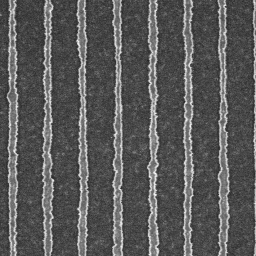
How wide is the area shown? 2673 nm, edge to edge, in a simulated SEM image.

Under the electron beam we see parallel lines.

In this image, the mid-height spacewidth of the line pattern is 28.6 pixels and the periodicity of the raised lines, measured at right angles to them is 366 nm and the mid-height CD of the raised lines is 67.8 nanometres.